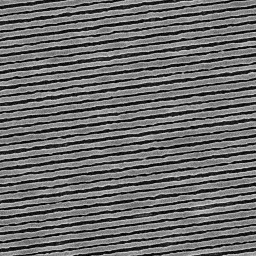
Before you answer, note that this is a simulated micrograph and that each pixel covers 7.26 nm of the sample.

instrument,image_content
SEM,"parallel lines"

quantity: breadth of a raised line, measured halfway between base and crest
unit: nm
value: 37.8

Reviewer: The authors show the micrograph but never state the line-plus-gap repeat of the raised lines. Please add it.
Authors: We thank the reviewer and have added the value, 58.3 nm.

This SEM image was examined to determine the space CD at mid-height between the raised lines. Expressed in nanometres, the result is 25.1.